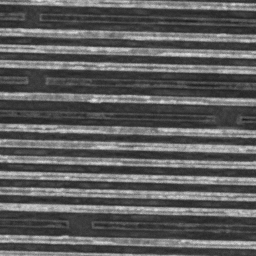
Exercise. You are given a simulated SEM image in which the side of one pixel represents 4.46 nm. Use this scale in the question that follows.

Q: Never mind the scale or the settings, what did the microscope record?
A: parallel lines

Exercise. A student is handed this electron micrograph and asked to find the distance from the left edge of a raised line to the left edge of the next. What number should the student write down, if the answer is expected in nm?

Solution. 70.7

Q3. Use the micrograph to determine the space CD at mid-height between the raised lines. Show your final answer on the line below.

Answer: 42.3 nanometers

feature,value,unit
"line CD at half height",30.6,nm